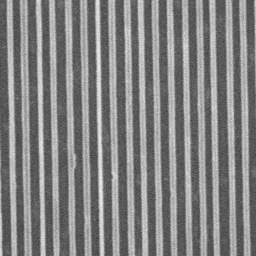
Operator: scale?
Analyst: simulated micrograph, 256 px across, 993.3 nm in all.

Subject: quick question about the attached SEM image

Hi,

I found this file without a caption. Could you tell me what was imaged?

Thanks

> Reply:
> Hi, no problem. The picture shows parallel lines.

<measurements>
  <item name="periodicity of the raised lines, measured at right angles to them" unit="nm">56.5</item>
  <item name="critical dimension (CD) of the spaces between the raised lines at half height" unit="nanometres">36.4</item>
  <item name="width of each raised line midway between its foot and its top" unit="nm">20.8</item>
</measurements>